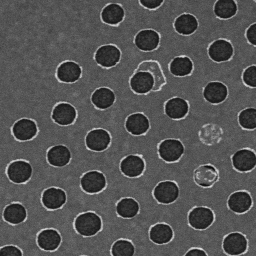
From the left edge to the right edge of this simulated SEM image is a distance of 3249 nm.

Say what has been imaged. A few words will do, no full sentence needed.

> a regular array of holes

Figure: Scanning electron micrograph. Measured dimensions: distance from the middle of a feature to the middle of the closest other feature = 533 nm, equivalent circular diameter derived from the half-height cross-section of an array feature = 0.289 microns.